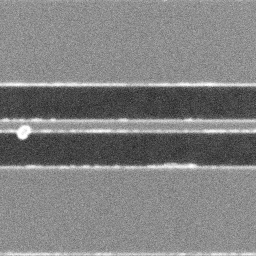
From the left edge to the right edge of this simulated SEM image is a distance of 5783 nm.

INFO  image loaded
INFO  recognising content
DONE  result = lines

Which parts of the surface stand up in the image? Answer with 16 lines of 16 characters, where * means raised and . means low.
****************
****************
****************
****************
****************
................
................
..*.............
................
................
****************
****************
****************
****************
****************
****************